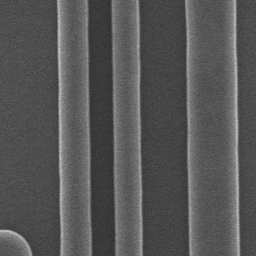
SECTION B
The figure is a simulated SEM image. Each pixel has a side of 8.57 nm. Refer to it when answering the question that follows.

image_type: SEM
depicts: groups of lines, slits or small figures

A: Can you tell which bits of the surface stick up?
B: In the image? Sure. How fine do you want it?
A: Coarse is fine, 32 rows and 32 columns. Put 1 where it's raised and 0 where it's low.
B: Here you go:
00000001111000111000000111111000
00000001111000111000000111111000
00000001111000111000000111111000
00000001111000111000000111111000
00000001111000111000000111111000
00000001111000111000000111111000
00000001111000111000000111111000
00000001111000111000000111111000
00000001111000111000000111111100
00000001111000111000000111111100
00000000111000111000000111111100
00000000111000111000000111111100
00000001111000111000000111111100
00000001111000111000000111111100
00000000111000111000000111111100
00000000111000111000000011111100
00000000111000111000000011111100
00000000111000111000000011111100
00000000111000111000000011111100
00000000111000111000000011111100
00000000111000111000000011111100
00000000111000111100000011111100
00000000111000111100000011111100
00000000111000111100000011111100
00000000111000111100000011111100
00000000111000111100000011111100
00000000111000111100000011111100
00000000111000111100000011111100
00000000111000011100000011111100
11000000111000011100000011111100
11100000111000011100000011111100
11110000111000011100000011111100